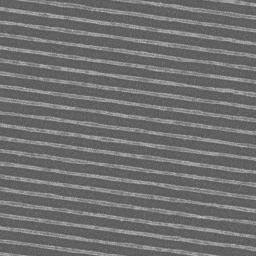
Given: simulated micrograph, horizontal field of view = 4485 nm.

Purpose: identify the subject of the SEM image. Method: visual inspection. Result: parallel lines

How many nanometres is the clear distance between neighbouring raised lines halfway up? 171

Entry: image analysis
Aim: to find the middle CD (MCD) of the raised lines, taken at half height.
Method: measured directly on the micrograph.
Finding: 56.4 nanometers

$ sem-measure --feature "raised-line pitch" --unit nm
223